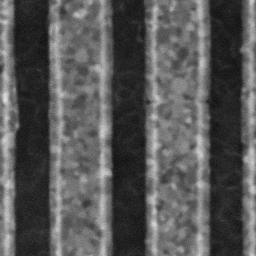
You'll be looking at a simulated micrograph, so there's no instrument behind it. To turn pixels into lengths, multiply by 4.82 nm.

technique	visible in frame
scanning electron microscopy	one or a few lines or trenches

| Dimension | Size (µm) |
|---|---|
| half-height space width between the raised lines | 0.25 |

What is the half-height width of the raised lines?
217 nm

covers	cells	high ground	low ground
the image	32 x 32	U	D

UDDDDDDUUUUUUDDDDDDUUUUUUDDDDDDD
UDDDDDDUUUUUUDDDDDDUUUUUUDDDDDDD
UDDDDDDUUUUUUDDDDDDUUUUUUDDDDDDD
UDDDDDDUUUUUUDDDDDDUUUUUUDDDDDDD
UDDDDDDUUUUUUDDDDDDUUUUUUDDDDDDD
UDDDDDDUUUUUUDDDDDDUUUUUUDDDDDDD
UDDDDDDUUUUUUDDDDDDUUUUUUDDDDDDU
UDDDDDDUUUUUUDDDDDDUUUUUUDDDDDDD
UDDDDDDUUUUUUDDDDDDUUUUUUDDDDDDD
UDDDDDDUUUUUUDDDDDDUUUUUUDDDDDDU
UDDDDDDUUUUUUDDDDDDUUUUUUDDDDDDU
UDDDDDDDUUUUUDDDDDDUUUUUUDDDDDDU
UDDDDDDDUUUUUDDDDDDDUUUUUDDDDDDU
UDDDDDDDUUUUUDDDDDDUUUUUUDDDDDDU
UDDDDDDDUUUUUDDDDDDUUUUUUDDDDDDU
UDDDDDDDUUUUUDDDDDDDUUUUUDDDDDDU
UDDDDDDDUUUUUDDDDDDUUUUUUDDDDDDU
UDDDDDDDUUUUUDDDDDDUUUUUUDDDDDDU
UDDDDDDUUUUUUDDDDDDUUUUUUDDDDDDU
UDDDDDDUUUUUUDDDDDDUUUUUUDDDDDDU
UDDDDDDUUUUUUDDDDDDUUUUUUDDDDDDD
UDDDDDDUUUUUUDDDDDDUUUUUUDDDDDDD
UDDDDDDUUUUUUDDDDDDUUUUUUDDDDDDD
UDDDDDDUUUUUUDDDDDDUUUUUUDDDDDDD
UDDDDDDUUUUUUDDDDDDUUUUUUDDDDDDD
UDDDDDDUUUUUUDDDDDDUUUUUUDDDDDDD
UDDDDDDUUUUUUDDDDDDUUUUUUDDDDDDD
UDDDDDDUUUUUUDDDDDDUUUUUUDDDDDDD
UDDDDDDUUUUUUDDDDDDUUUUUUDDDDDDD
UDDDDDDUUUUUUDDDDDDUUUUUUDDDDDDD
UDDDDDDUUUUUUDDDDDDUUUUUUDDDDDDD
UDDDDDDUUUUUUDDDDDDUUUUUUDDDDDDD